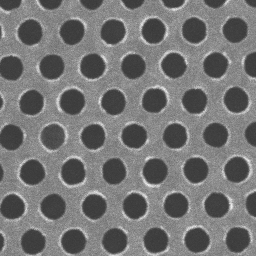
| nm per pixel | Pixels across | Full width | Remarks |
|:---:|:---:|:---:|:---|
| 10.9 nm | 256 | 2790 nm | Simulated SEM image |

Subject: a regular array of holes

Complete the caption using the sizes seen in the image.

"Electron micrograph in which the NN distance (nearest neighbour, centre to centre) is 438 nm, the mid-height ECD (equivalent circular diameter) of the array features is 280 nanometers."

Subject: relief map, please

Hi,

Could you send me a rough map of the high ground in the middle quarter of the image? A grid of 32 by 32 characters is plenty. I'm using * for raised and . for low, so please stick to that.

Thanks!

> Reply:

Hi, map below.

****......****......****.......*
****......****......****.......*
*****.....*****.....*****.....**
******...*******...*******..****
********************************
********************************
*...*******...*******....******.
.....*****.....*****.....*****..
.....****......*****......****..
.....****.......***.......***...
.....****......*****......****..
.....*****.....*****.....******.
*...*******...******************
********************************
********************************
******...*******...*******....**
*****.....*****.....*****......*
****......****.......****......*
****......****.......****......*
****......*****.....*****......*
*****.....*****.....******....**
******..************************
********************************
**.*********.*********..********
.....*****.....******....*****..
.....*****.....*****......****..
.....****.......****......****..
.....****.......****......****..
.....*****.....*****.....******.
.....******...*******....******.
********************************
********************************